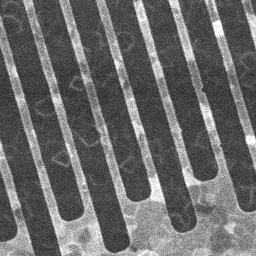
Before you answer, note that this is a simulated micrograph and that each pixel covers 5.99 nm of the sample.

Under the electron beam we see parallel lines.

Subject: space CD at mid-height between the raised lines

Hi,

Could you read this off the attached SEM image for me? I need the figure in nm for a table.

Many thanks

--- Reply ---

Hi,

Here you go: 163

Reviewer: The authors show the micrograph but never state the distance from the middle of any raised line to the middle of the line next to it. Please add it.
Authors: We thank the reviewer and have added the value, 209 nanometers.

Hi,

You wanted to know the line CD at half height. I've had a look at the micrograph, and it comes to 47.4 nanometers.